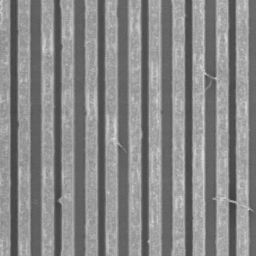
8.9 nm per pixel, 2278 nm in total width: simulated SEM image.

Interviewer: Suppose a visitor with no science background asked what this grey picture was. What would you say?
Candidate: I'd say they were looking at parallel lines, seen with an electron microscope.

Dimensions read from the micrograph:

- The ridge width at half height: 107 nm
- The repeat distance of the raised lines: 195 nanometers